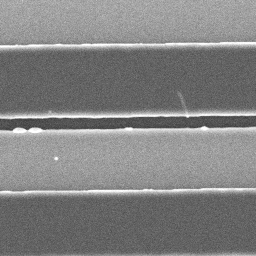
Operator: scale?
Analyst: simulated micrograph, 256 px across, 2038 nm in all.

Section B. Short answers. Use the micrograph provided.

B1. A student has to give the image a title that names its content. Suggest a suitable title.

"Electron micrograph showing lines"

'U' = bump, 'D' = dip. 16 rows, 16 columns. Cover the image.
DDDDDDDDDDDDDDDD
DDDDDDDDDDDDDDDD
DDDDDDDDDDDDDDDD
UUUUUUUUUUUUUUUU
UUUUUUUUUUUUUUUU
UUUUUUUUUUUUUUUU
UUUUUUUUUUUUUUUU
DDDDDDDDDDDDDDDD
DDDDDDDDDDDDDDDD
DDDDDDDDDDDDDDDD
DDDDDDDDDDDDDDDD
DDDDDDDDDDDDDDDD
UUUUUUUUUUUUUUUU
UUUUUUUUUUUUUUUU
UUUUUUUUUUUUUUUU
UUUUUUUUUUUUUUUU